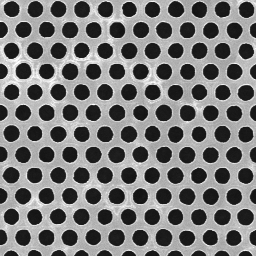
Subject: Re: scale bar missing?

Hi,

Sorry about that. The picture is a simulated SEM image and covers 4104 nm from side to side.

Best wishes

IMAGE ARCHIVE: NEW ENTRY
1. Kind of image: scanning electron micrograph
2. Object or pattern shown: a regular array of holes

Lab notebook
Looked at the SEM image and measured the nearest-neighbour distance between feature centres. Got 0.373 microns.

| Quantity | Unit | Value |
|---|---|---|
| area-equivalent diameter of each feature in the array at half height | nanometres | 259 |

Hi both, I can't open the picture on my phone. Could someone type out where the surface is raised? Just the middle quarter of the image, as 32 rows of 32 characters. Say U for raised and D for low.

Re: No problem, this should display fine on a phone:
DDDUUUDDDUUUDDDUUUDDDUUUDDUUUUDD
DDDDUDDDDUUDDDDUUDDDDUUDDDDUUDDD
DDDDUDDDDUUDDDDUUDDDDUUDDDDUUDDD
DDDUUUDDDUUUDDDUUUDDUUUUDDUUUUDD
UUUUUUUUUUUUUUUUUUUUUUUUUUUUUUUU
UUUDDDUUUDDUUUUDDUUUUDDUUUUDDUUU
UUDDDDUUDDDDUUDDDDUUDDDDUUDDDDUU
UUUDDDDUDDDDUUDDDDUUDDDDUUDDDDUU
UUUDDDUUUDDDUUUDDDUUUDDDUUDDDUUU
UUUUUUUUUUUUUUUUUUUUUUUUUUUUUUUU
DDDUUUDDUUUUDDUUUUDDUUUUDDUUUUDD
DDDUUDDDDUUDDDDUUDDDDUUDDDDUUDDD
DDDDUDDDDUUDDDDUUDDDDUUDDDDUUDDD
DDDUUUDDDUUUDDDUUUDDDUUDDDDUUDDD
UUUUUUUUUUUUUUUUUUUUUUUUUUUUUUUU
UUUUUUUUUUDUUUUUDUUUUUDUUUUUUUUU
UUUDDDUUUDDDUUUDDDUUDDDDUUDDDDUU
DUDDDDUUDDDDUUDDDDUUDDDDUUDDDDUU
UUUDDDUUDDDDUUDDDDUUDDDDUUDDDDUU
UUUUUUUUUUDUUUUUDUUUUUUUUUUDDUUU
UUUUUUUUUUUUUUUUUUUUUUUUUUUUUUUU
DDDUUUDDDUUDDDDUUDDDDUUDDDDUUDDD
DDDUUDDDDUUDDDDUUDDDDUUDDDDUUDDD
DDDUUDDDDUUDDDDUUDDDDUUDDDDUUDDD
UDUUUUDDDUUUDDUUUUDDUUUUDDUUUUDD
UUUUUUUUUUUUUUUUUUUUUUUUUUUUUUUU
UUUDDDUUUDDDUUUDDDUUUDDUUUDDDUUU
DUDDDDUUDDDDUUDDDDUUDDDDUUDDDDUU
UUDDDDUUDDDDUUDDDDUUDDDDUUDDDDUU
UUUDDDUUUDDUUUUDDDUUUDDUUUUDDUUU
UUUUUUUUUUUUUUUUUUUUUUUUUUUUUUUU
DDDUUUDDDUUUDDUUUUDDUUUUDDUUUUDD